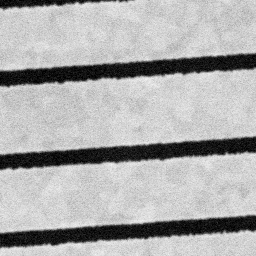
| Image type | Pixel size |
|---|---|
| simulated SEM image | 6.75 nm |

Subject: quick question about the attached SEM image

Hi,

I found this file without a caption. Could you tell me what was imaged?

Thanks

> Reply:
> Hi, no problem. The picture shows lines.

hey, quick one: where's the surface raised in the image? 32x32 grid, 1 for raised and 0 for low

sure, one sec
00000000011111111111111111111111
11111111111111111111111111111111
11111111111111111111111111111111
11111111111111111111111111111111
11111111111111111111111111111111
11111111111111111111111111111111
11111111111111111111111111111111
11111111111111111110000000000000
11111000000000000000000000000000
00000000000000000000111111111111
00000111111111111111111111111111
11111111111111111111111111111111
11111111111111111111111111111111
11111111111111111111111111111111
11111111111111111111111111111111
11111111111111111111111111111111
11111111111111111111111111111111
11111111111111111111111110000000
11111111111000000000000000000000
00000000000000000000000000111111
00000000000001111111111111111111
11111111111111111111111111111111
11111111111111111111111111111111
11111111111111111111111111111111
11111111111111111111111111111111
11111111111111111111111111111111
11111111111111111111111111111111
11111111111111111111110000000000
11111111000000000000000000000000
00000000000000000000000111111111
00000000111111111111111111111111
11111111111111111111111111111111